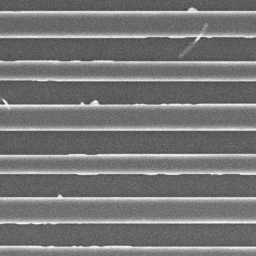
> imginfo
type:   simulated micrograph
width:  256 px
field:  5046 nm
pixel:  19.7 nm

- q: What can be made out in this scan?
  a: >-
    lines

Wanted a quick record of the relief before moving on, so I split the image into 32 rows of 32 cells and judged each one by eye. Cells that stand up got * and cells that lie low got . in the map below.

................................
..******************************
********************************
********************************
********************************
................................
................................
................................
********************************
********************************
................................
................................
................................
********************************
********************************
********************************
................................
................................
................................
********************************
********************************
********************************
................................
................................
................................
********************************
********************************
********************************
................................
................................
................................
********************************